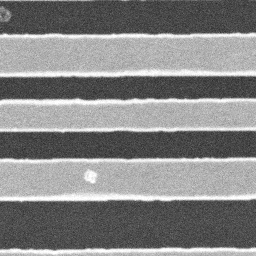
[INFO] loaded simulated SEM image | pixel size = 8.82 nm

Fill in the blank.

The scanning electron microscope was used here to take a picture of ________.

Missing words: lines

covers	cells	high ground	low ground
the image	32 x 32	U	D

DDDDDDDDDDDDDDDDDDDDDDDDDDDDDDDD
DDDDDDDDDDDDDDDDDDDDDDDDDDDDDDDD
DDDDDDDDDDDDDDDDDDDDDDDDDDDDDDDD
DDDDDDDDDDDDDDDDDDDDDDDDDDDDDDDD
UUUUUUUUUUUUUUUUUUUUUUUUUUUUUUUU
UUUUUUUUUUUUUUUUUUUUUUUUUUUUUUUU
UUUUUUUUUUUUUUUUUUUUUUUUUUUUUUUU
UUUUUUUUUUUUUUUUUUUUUUUUUUUUUUUU
UUUUUUUUUUUUUUUUUUUUUUUUUUUUUUUU
UDUUUUUDDDDDDDUDDDDDDDDDDDDDDDDD
DDDDDDDDDDDDDDDDDDDDDDDDDDDDDDDD
DDDDDDDDDDDDDDDDDDDDDDDDDDDDDDDD
DDDDDDDDDDDDDDDDDDDDDDDDDUUDUUUU
UUUUUUUUUUUUUUUUUUUUUUUUUUUUUUUU
UUUUUUUUUUUUUUUUUUUUUUUUUUUUUUUU
UUUUUUUUUUUUUUUUUUUUUUUUUUUUUUUU
DDDDDDDDDDDDDDDDDDDDDDDDDDDDDDDD
DDDDDDDDDDDDDDDDDDDDDDDDDDDDDDDD
DDDDDDDDDDDDDDDDDDDDDDDDDDDDDDDD
DDDDDDDDDDDDDDDDDDDDDDDDDDDDDDDD
UUUUUUUUUUUUUUUUUUUUUUUUUUUUUUUU
UUUUUUUUUUUUUUUUUUUUUUUUUUUUUUUU
UUUUUUUUUUUUUUUUUUUUUUUUUUUUUUUU
UUUUUUUUUUUUUUUUUUUUUUUUUUUUUUUU
UUUUUUUUUUUUUUUUUUUUUUUUUUUUUUUU
DDDDDDDDDDDDDDDDDDDDDDDDDDDDDDDD
DDDDDDDDDDDDDDDDDDDDDDDDDDDDDDDD
DDDDDDDDDDDDDDDDDDDDDDDDDDDDDDDD
DDDDDDDDDDDDDDDDDDDDDDDDDDDDDDDD
DDDDDDDDDDDDDDDDDDDDDDDDDDDDDDDD
DDDDDDDDDDDDDDDDDDDDDDDDDDDDDDDD
UUUUUUUUUUUUUUUUUUUUUUUUUUUUUUUU